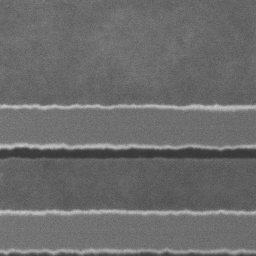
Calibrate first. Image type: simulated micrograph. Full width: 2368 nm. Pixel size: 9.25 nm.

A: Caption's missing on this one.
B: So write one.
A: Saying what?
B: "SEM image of lines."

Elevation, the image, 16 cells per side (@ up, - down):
----------------
----------------
----------------
----------------
----------------
----------------
----------------
@@@@@@@@@@@@@@@@
@@@@@@@@@@@@@@@@
----------------
----------------
----------------
----------------
@@@@@@@@@@@@@@@@
@@@@@@@@@@@@@@@@
@@@@@@@@@@@@@@@@